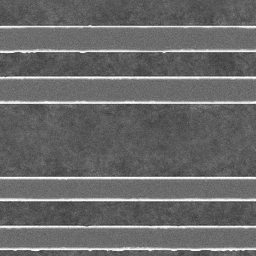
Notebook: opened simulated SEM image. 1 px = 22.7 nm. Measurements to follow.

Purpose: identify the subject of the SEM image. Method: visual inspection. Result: lines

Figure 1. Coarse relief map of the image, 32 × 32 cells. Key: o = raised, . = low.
................................
................................
................................
oooooooooooooooooooooooooooooooo
oooooooooooooooooooooooooooooooo
oooooooooooooooooooooooooooooooo
oo........o.....................
................................
................................
................................
oooooooooooooooooooooooooooooooo
oooooooooooooooooooooooooooooooo
oooooooooooooooooooooooooooooooo
................................
................................
................................
................................
................................
................................
................................
................................
................................
oooooooooooooooooooooooooooooooo
oooooooooooooooooooooooooooooooo
oooooooooooooooooooooooooooooooo
................................
................................
................................
oooooooooooooooooooooooooooooooo
oooooooooooooooooooooooooooooooo
oooooooooooooooooooooooooooooooo
................................